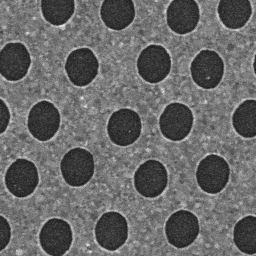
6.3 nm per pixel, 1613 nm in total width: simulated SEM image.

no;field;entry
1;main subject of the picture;a regular array of holes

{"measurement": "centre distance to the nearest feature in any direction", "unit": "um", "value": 0.36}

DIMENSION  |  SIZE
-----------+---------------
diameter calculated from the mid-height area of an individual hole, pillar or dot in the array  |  235 nm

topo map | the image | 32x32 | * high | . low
*****....****....****....**....*
*****....***.....****....**.....
******...****....****....***...*
**************..*****....***..**
********************************
*..****************.************
....*****...******...****..*****
....****....*****....***....****
....****....*****....***....****
...*****....*****....***....****
*********..*************...*****
********************************
*******************************.
.***...********.*****...*****...
.**.....******...***....*****...
.**.....*****.....**....*****...
.***...******.....**....*****...
*****.********...****..*********
*********.**********************
********....**************..****
*...***.....******..*****....***
*....***....*****....***.....***
.....***...******....****....***
*....************....****...****
**..**************..************
********************************
*************..*******..********
.*****..****....*****....*****..
.****....***....*****....****...
.****....***....*****....****...
.****....***....*****...*****...
******..**********************..